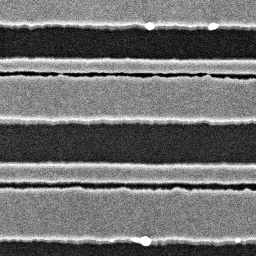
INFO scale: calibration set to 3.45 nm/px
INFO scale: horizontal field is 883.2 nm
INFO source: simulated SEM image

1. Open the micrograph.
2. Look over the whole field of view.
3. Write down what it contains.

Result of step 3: lines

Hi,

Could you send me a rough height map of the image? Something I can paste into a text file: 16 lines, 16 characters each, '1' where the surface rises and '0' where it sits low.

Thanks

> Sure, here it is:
1111111111111111
1111111111111111
0000000000000000
0000000000000000
1111111111111111
1111111111111111
1111111111111111
0111111111111111
0000000000000000
0000000000000000
1111111111111111
1111111111111111
1111111111111111
1111111111111111
1111111111111111
0000000000000000